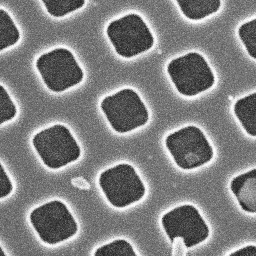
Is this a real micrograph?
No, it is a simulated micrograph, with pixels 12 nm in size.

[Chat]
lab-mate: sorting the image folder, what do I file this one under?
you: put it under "a regular array of holes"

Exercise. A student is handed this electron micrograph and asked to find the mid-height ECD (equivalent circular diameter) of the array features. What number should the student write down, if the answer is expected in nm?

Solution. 541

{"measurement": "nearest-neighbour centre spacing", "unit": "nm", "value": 902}